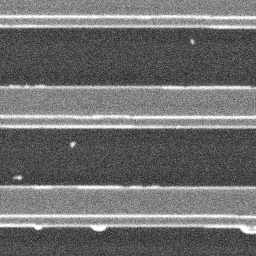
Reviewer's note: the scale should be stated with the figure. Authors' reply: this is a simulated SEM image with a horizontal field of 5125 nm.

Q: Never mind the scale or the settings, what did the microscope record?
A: lines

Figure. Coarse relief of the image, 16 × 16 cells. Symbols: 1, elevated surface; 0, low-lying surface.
1111111111111111
1111111111111111
0000000000000000
0000000000000000
0000000000000000
1111111111100010
1111111111111111
1111111111111111
0000000000000000
0000000000000000
0000000000000000
0000000000000000
1111111111111111
1111111111111111
0000000000000001
0000000000000000